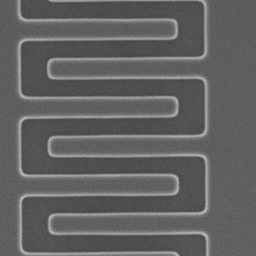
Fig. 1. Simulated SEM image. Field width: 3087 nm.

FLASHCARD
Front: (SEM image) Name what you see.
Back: groups of lines, slits or small figures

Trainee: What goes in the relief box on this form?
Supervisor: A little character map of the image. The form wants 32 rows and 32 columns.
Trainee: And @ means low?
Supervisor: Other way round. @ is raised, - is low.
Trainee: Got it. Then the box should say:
@@-----------------------@@@@@@@
@@@-----------------------@@@@@@
@@@@----@@@@@@@-@@@@@@----@@@@@@
@@@@@@@@@@@@@@@@@@@@@@----@@@@@@
@@@@@@@@@@@@@@@@@@@@@@----@@@@@@
@@@-----------------------@@@@@@
@@------------------------@@@@@@
@@-----@@@@@@@@@@@@@@@@@@@@@@@@@
@@@---@@@@@@@@@@@@@@@@@@@@@@@@@@
@@@---@@@@@@@@@@@@@@@@@@@@@@@@@@
@@@-----------------------@@@@@@
@@@-----------------------@@@@@@
@@@@@@@@@@@@@@@@@@@@@@----@@@@@@
@@@@@@@@@@@@@@@@@@@@@@----@@@@@@
@@@@@@@@@@@@@@@@@@@@@@----@@@@@@
@@@-----------------------@@@@@@
@@@----------------------@@@@@@@
@@@---@@@@@@@@@@@@@@@@@@@@@@@@@@
@@@---@@@@@@@@@@@@@@@@@@@@@@@@@@
@@@----@@@@@@@@@@--------@@@@@@@
@@@-----------------------@@@@@@
@@@-----------------------@@@@@@
@@@@@@@@@@@@@@@@@@@@@@----@@@@@@
@@@@@@@@@@@@@@@@@@@@@@----@@@@@@
@@@@----------------------@@@@@@
@@@-----------------------@@@@@@
@@@----------------------@@@@@@@
@@@---@@@@@@@@@@@@@@@@@@@@@@@@@@
@@@---@@@@@@@@@@@@@@@@@@@@@@@@@@
@@@-----------------------@@@@@@
@@@-----------------------@@@@@@
@@@-----------------------@@@@@@